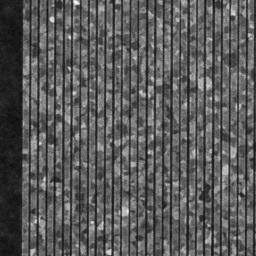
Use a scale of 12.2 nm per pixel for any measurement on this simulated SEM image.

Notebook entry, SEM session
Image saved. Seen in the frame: parallel lines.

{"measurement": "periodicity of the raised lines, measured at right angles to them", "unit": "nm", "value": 102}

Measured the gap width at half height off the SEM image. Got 33.6 nm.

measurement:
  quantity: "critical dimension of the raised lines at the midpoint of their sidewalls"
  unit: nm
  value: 67.2